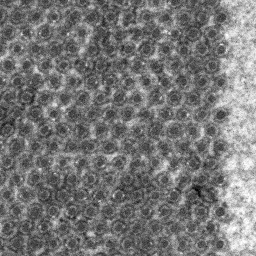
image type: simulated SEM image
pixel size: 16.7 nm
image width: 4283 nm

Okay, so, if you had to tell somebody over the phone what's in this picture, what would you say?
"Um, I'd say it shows a regular array of raised bodies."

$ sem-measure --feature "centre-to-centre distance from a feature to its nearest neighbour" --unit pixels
18.3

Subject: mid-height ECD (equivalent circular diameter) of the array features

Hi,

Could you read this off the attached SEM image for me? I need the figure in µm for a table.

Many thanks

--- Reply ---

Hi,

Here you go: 0.168